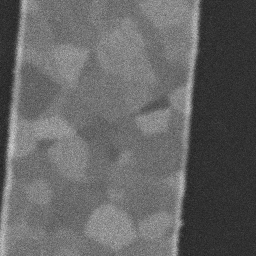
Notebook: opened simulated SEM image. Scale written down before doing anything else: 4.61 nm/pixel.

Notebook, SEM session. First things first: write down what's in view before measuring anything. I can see one or a few lines or trenches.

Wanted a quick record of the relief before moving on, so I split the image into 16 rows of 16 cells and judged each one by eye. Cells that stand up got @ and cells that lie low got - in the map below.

-@@@@@@@@@@@----
-@@@@@@@@@@@----
-@@@@@@@@@@@----
-@@@@@@@@@@@----
-@@@@@@@@@@@----
-@@@@@@@@@@@----
-@@@@@@@@@@@----
-@@@@@@@@@@@----
-@@@@@@@@@@@----
-@@@@@@@@@@@----
-@@@@@@@@@@-----
@@@@@@@@@@@-----
@@@@@@@@@@@-----
@@@@@@@@@@@-----
@@@@@@@@@@@-----
@@@@@@@@@@@-----